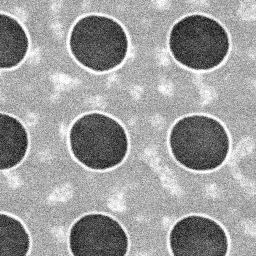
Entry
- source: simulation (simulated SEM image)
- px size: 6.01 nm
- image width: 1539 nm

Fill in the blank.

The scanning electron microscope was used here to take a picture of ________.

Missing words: holes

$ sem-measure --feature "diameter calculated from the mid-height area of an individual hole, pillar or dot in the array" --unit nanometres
353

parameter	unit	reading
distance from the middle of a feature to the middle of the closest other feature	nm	597